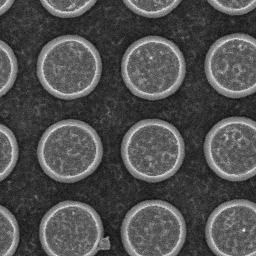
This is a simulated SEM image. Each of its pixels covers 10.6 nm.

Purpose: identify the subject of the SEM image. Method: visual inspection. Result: raised bodies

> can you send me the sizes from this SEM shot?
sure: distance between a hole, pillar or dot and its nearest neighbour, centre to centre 0.88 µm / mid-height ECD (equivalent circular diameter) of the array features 627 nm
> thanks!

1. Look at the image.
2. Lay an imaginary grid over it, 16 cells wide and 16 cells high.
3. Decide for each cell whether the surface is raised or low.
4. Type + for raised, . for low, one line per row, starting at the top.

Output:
...++...+++...++
................
....+....+....++
+..+++..+++..+++
+..+++..+++..+++
...+++..+++...++
................
................
+..+++..+++..+++
+..+++..+++..+++
+..+++..+++..+++
................
................
+..+++..+++..+++
+..+++..+++..+++
+..+++..+++..+++